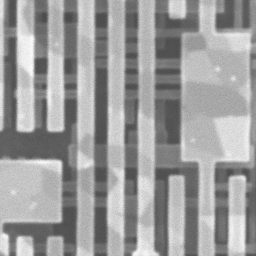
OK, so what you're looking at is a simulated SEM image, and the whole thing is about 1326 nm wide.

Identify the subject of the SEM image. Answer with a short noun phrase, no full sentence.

wiring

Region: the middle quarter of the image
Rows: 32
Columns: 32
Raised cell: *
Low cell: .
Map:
....***....****....****......***
....****...****....****......***
....****...****....***.......***
....****...****....***.......***
....****...****....***.......***
....****...****....***.......***
....***....****....***.......***
....***....****....***.......***
....***....****....***.......***
....***....****....***.......***
....***....****....***.......***
....***....****....***.......***
....***....****....***.......***
....***....****....***.......***
....***....****....***.......***
....***....****....***.......***
....***....****....***.......***
....***....****....***.......***
....***....****....***.......***
....***....****....***.......***
....***....****....***.......***
....***....****....***.......***
....***....****....***.......***
....***....****....***.......***
....***....****....***..........
....***....****....***..........
....***....****....***..........
....***....****....***..........
....***....****....***....****..
....***....****....***....****..
....***....****....***....****..
...****....****....***....****..